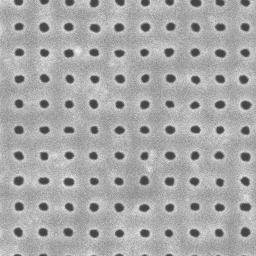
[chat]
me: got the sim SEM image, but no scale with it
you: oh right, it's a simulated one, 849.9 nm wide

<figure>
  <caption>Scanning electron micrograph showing a regular array of holes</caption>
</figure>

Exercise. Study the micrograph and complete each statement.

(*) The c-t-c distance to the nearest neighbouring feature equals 82.5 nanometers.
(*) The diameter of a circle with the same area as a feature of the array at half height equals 8.83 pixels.